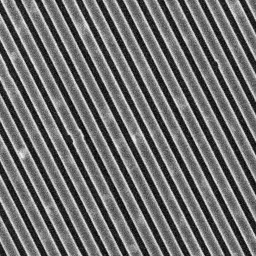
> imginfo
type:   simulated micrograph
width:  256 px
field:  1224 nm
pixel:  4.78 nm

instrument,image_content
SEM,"parallel lines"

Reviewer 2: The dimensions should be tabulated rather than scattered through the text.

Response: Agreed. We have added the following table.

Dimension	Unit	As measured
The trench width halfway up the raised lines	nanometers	33.1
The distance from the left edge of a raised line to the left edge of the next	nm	87.1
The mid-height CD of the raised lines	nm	56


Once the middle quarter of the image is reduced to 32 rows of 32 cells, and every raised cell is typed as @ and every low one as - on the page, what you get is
@--@@@--@@@--@@@--@@@--@@@--@@@-
@--@@@@-@@@---@@@--@@@--@@@--@@@
@@--@@@--@@@--@@@--@@@--@@@--@@@
@@--@@@@-@@@---@@@--@@@--@@@--@@
@@@--@@@--@@@--@@@--@@@--@@@--@@
@@@--@@@@--@@---@@@--@@@--@@@--@
-@@@--@@@--@@@--@@@--@@@--@@@--@
-@@@--@@@@-@@@---@@@--@@@--@@@--
--@@@--@@@--@@@--@@@--@@@--@@@--
--@@@--@@@@--@@---@@@--@@@--@@@-
@--@@@--@@@--@@@--@@@--@@@--@@@-
@--@@@--@@@@--@@@--@@@--@@@--@@@
@@--@@@--@@@--@@@--@@@--@@@--@@@
@@--@@@--@@@@--@@@--@@@--@@@--@@
@@@--@@@--@@@--@@@--@@@--@@@--@@
@@@--@@@--@@@@-@@@@--@@@--@@@--@
-@@@--@@@--@@@--@@@--@@@--@@@--@
-@@@--@@@--@@@---@@@--@@@--@@@--
--@@@--@@@--@@@--@-@--@@@--@@@--
--@@@--@@@--@@@@--@@@--@@@--@@@-
@--@@@--@@@--@@@--@@@--@@@--@@@-
@--@@@--@@@--@@@@--@@@--@@@--@@@
@@--@@@--@@@--@@@--@@@--@@@--@@@
@@--@@@--@@@--@@@@--@@@--@@@--@@
@@@--@@@--@@@--@@@--@@@--@@@--@@
@@@--@@@--@@@--@@@@--@@@--@@@--@
-@@@--@@@--@@@--@@@--@@@--@@@--@
-@@@--@@@--@@@--@@@@--@@@--@@@--
--@@@--@@@--@@@--@@@--@@@--@@@--
--@@@--@@@--@@@--@@@@--@@@--@@@-
@--@@@--@@@--@@@--@@@--@@@--@@@-
@--@@@--@@@--@@@--@@@@-@@@@--@@@